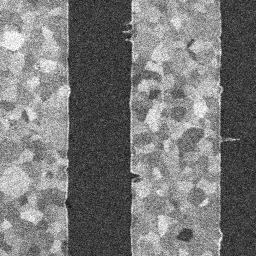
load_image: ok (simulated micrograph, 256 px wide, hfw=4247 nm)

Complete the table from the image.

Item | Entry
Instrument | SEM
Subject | one or a few lines or trenches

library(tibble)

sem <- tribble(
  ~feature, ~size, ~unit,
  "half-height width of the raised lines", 1450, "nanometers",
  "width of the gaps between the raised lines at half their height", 64.9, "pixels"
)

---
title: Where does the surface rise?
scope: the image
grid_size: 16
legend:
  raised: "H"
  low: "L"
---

HHHHLLLLHHHHHHLL
HHHHLLLLHHHHHHLL
HHHHLLLLHHHHHHLL
HHHHLLLLHHHHHHLL
HHHHLLLLHHHHHHLL
HHHHLLLLHHHHHHLL
HHHHLLLLHHHHHHLL
HHHHLLLLHHHHHHLL
HHHHLLLLHHHHHHLL
HHHHLLLLHHHHHHLL
HHHHLLLLHHHHHHLL
HHHHLLLLHHHHHHLL
HHHHLLLLHHHHHHLL
HHHHLLLLHHHHHHLL
HHHHLLLLHHHHHHLL
HHHHLLLLHHHHHHLL